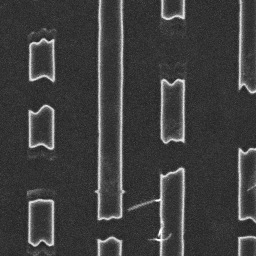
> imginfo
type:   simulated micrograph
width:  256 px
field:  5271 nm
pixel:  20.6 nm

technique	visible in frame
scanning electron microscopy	one or a few lines or trenches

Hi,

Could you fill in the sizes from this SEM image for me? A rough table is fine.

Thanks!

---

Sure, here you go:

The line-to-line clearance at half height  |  939 nanometers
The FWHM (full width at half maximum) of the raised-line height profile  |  461 nm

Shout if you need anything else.